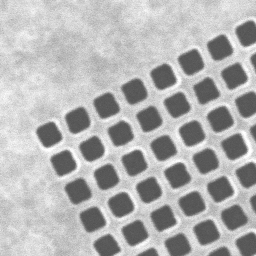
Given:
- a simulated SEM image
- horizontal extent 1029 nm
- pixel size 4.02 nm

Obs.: a regular array of holes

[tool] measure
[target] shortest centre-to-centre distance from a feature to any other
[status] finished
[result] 126 nanometres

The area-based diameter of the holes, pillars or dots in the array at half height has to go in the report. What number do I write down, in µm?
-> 0.101